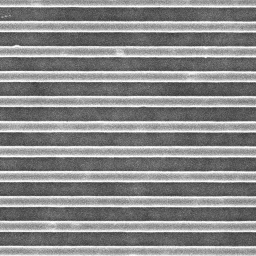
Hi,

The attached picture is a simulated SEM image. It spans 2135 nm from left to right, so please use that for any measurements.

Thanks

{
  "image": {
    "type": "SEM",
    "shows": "parallel lines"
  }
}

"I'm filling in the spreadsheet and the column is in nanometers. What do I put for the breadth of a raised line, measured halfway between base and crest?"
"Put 81.4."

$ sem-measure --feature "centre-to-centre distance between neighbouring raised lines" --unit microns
0.208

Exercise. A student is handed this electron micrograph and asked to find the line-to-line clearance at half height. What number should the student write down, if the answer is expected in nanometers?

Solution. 125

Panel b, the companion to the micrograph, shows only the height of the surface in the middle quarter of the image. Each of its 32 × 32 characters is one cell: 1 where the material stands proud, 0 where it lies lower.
00000000000000000000000000000000
00000000000000000000000000000000
11111111111111111111111111111111
11111111111111111111111111111111
00000000000000000000000000000000
00000000000000000000000000000000
00000000000000000000000000000000
00000000000000000000000000000000
11111111111111111111111111111111
11111111111111111111111111111111
00000000000000000000000000000010
00000000000000000000000000000000
00000000000000000000000000000000
00000000000000000000000000000000
11111111111111111111111111111000
11111111111111111111111111111111
11111111111111111111111111111111
00000000000000000000000000000000
00000000000000000000000000000000
00000000000000000000000000000000
00000000000000000000000000000000
11111111111111111111111111111111
11111111111111111111111111111111
00000000000000000000000000000000
00000000000000000000000000000000
00000000000000000000000000000000
00000000000000000000000000000000
11111111111111111111111111111111
11111111111111111111111111111111
00000000000000000000000000000000
00000000000000000000000000000000
00000000000000000000000000000000